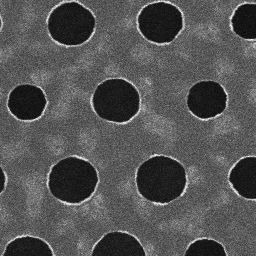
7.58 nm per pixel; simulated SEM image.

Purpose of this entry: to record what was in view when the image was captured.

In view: holes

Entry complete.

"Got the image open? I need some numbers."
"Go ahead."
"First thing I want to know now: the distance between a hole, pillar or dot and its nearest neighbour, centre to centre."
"672 nanometers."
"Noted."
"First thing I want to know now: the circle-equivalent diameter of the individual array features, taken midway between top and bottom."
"337 nm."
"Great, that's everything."